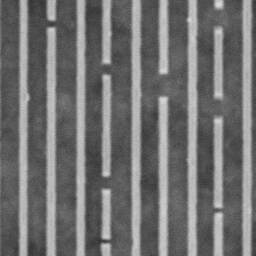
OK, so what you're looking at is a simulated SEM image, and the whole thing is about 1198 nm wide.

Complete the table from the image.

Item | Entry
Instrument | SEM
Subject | parallel lines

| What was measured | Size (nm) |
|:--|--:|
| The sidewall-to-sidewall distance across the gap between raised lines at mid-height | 101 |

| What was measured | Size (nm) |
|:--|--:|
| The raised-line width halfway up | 30.4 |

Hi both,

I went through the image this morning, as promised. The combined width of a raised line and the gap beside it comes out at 131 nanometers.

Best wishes